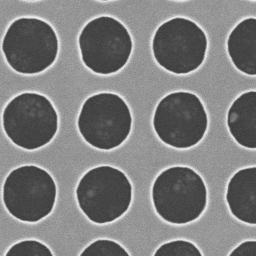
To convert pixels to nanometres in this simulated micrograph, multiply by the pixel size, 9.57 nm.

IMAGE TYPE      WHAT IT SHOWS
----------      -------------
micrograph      a regular array of holes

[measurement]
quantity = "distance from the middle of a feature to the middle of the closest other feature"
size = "710 nanometres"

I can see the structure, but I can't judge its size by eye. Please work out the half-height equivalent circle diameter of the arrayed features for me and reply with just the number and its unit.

54.8 pixels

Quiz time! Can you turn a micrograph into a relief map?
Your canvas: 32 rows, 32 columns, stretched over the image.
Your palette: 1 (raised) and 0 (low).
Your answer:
11111111111111111111111111111111
11111111111111111111111111111111
11000111111100111111100011111110
10000011111000001111000001111000
10000001110000001110000000111000
00000001110000001110000000110000
00000001110000001110000000111000
10000001110000001111000001111000
11000011111000011111100001111100
11111111111111111111111111111111
11111111111111111111111111111111
11111111111111111111111111111110
11000011111000011111000001111000
10000001110000001111000001111000
00000001110000001110000000110000
00000001110000001110000000111000
10000001110000001111000000111000
10000011111000001111000001111100
11100111111100111111110111111110
11111111111111111111111111111111
11111111111111111111111111111111
10000011111000011111000011111100
10000001110000001110000001111000
00000001110000001110000000110000
00000001110000001110000000110000
10000001110000001110000000111000
10000011110000001111000001111000
11100111111000111111100011111100
11111111111111111111111111111111
11111111111111111111111111111111
11000111111000011111100011111100
10000011110000001110000001111000